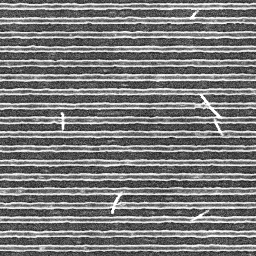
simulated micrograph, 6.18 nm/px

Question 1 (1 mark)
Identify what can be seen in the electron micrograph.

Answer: parallel lines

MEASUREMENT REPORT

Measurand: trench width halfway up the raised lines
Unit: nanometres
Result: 56.4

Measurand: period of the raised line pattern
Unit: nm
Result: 87.9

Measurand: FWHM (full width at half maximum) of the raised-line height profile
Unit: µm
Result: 0.034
